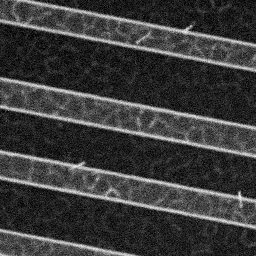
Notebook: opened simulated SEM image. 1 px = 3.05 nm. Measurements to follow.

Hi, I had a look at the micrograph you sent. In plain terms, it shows one or a few lines or trenches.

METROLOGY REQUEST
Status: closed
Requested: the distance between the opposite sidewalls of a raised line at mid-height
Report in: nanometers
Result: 81.3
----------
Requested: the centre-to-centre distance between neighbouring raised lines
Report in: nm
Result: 233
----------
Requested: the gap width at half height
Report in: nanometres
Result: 157